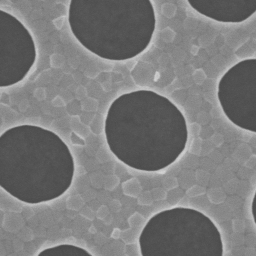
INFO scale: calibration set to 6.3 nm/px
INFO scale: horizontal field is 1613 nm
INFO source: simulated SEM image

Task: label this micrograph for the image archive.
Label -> holes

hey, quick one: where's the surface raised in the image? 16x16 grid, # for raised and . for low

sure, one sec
####......##....
.###......######
..###....#######
..####..########
..############..
##############..
#######....###..
#######.....##..
....###.....####
....###....#####
.....###..######
....############
#..#############
##########...###
#########.....##
###..####.....##